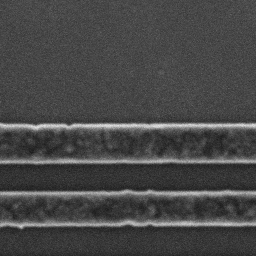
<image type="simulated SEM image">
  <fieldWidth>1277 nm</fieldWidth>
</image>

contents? one or a few lines or trenches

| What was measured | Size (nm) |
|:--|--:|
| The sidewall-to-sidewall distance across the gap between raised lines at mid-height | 146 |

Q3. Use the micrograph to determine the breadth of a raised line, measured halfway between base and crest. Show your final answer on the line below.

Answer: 175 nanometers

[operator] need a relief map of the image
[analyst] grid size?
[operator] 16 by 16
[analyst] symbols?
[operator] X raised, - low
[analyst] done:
----------------
----------------
----------------
----------------
----------------
----------------
----------------
----------------
XXXXXXXXXXXXXXXX
XXXXXXXXXXXXXXXX
----------------
----------------
XXXXXXXXXXXXXXXX
XXXXXXXXXXXXXXXX
----------------
----------------